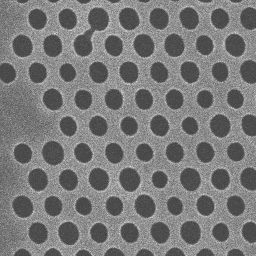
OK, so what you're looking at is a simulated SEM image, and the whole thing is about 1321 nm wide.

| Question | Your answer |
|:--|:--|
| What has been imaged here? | a regular array of holes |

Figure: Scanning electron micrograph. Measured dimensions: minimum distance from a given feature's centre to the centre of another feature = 0.156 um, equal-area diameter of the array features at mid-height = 103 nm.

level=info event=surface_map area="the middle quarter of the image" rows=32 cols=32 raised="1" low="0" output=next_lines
00111100001111000011110001111000
00011100000111000001100000111000
00011100000111000001110000111000
00011110000111000011110000111100
11111111001111100011111001111110
11111111111111111111111111111111
11110111111000111110011111101111
11100001110000111100001111000011
11000001110000011100001110000011
11100001110000011100001110000011
11100001111000111100001111000011
11110111111101111111111111111111
11111111111111111111111111111111
00111110001111100111110001111100
00011100000111000011110000111100
00011100000111000001110000111000
00011110000111000011110000111100
00011110001111100011111000111110
11111111111111111111111111111111
11111111111111111111111111111111
11100011111000111110011111000111
11100001110000011100001110000011
11100001110000011100001110000011
11100001111000011100001111000011
11110011111100111111111111100111
11111111111111111111111111111111
00111110001111100011111111111100
00011100000111000001110001111000
00001100000111000001110000111000
00001100000111000001110000111000
00011110000111000001111000111000
10111111001111100011111111111110